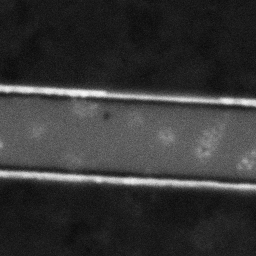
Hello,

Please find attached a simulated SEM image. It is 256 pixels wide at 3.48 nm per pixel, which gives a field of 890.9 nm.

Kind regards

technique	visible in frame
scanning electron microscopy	one or a few lines or trenches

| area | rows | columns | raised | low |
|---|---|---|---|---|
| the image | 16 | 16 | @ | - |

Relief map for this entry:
@@@@@@@@@@@@@@@@
@@@@@@@@@@@@@@@@
@@@@@@@@@@@@@@@@
@@@@@@@@@@@@@@@@
@@@@@@@@@@@@@@@@
@@@@@@@@@@@@@@@@
---------------@
----------------
----------------
----------------
----------------
@@@@@@@@@@@@@@--
@@@@@@@@@@@@@@@@
@@@@@@@@@@@@@@@@
@@@@@@@@@@@@@@@@
@@@@@@@@@@@@@@@@